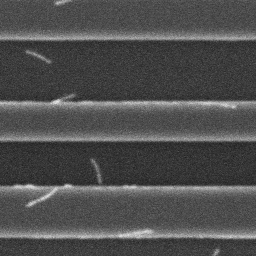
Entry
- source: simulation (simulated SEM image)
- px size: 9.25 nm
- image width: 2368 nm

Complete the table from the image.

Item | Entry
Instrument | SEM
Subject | lines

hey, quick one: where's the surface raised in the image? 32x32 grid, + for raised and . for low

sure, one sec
++++++++++++++++++++++++++++++++
++++++++++++++++++++++++++++++++
++++++++++++++++++++++++++++++++
++++++++++++++++++++++++++++++++
++++++++++++++++++++++++++++++++
................................
................................
................................
................................
................................
................................
................................
................................
++++++++++++++++++++++++++++++++
++++++++++++++++++++++++++++++++
++++++++++++++++++++++++++++++++
++++++++++++++++++++++++++++++++
++++++++++++++++++++++++++++++++
................................
................................
................................
................................
................................
++++++++++++++++++++++++++++++++
++++++++++++++++++++++++++++++++
++++++++++++++++++++++++++++++++
++++++++++++++++++++++++++++++++
++++++++++++++++++++++++++++++++
++++++++++++++++++++++++++++++++
++++++++++++++++++++++++++++++++
................................
................................